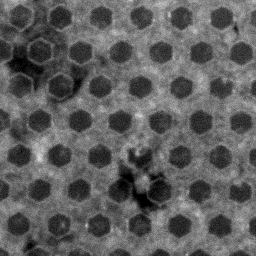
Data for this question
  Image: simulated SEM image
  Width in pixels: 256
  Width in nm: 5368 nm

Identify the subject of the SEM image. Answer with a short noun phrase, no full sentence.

a regular array of raised bodies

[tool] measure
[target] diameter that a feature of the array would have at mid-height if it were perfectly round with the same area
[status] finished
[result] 0.533 microns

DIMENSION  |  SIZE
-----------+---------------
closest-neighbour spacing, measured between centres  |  0.834 micrometres